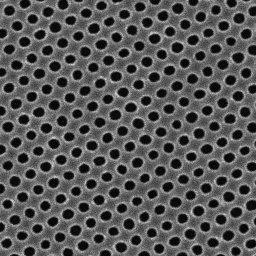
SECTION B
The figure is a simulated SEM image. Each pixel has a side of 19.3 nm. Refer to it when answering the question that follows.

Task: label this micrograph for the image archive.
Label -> a regular array of holes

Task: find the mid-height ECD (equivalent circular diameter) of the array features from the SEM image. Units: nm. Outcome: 206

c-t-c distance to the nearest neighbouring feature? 324 nm